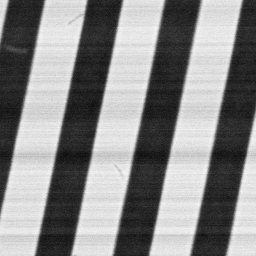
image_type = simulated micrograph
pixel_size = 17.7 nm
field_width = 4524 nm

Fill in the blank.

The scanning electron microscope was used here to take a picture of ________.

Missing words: lines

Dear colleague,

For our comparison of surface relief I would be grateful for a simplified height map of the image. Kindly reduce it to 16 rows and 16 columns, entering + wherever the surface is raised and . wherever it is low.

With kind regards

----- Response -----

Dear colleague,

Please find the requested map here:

...++...++...++.
...++..+++..+++.
..+++..+++..+++.
..+++..+++..++..
..+++..++...++..
..++...++..+++..
..++..+++..+++..
.+++..+++..+++..
.+++..+++..++...
.+++..++...++..+
.++...++..+++..+
+++..+++..+++..+
+++..+++..+++..+
+++..+++..++...+
++...++...++..++
++...++..+++..++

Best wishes